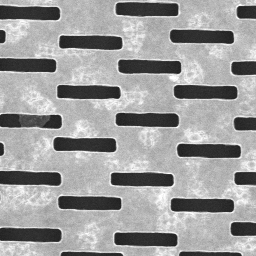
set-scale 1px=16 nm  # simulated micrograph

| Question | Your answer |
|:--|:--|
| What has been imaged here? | a regular array of holes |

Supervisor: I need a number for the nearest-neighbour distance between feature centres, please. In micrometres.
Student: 0.88